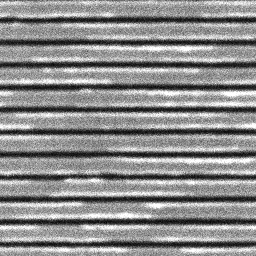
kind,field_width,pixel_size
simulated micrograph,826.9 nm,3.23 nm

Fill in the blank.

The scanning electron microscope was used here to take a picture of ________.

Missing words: parallel lines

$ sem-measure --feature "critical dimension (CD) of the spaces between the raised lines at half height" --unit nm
19.8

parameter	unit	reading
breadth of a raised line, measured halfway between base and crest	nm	50.9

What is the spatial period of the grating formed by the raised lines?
22.4 pixels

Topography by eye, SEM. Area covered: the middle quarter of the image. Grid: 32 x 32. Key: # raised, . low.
................................
################################
################################
################################
################################
................................
................................
################################
################################
################################
.......................###......
................................
################################
################################
################################
################################
................................
................................
################################
################################
################################
################################
................................
................................
################################
################################
################################
................................
................................
################################
################################
################################